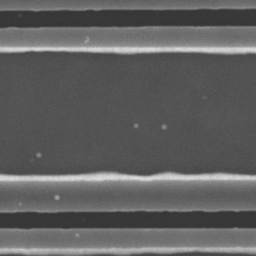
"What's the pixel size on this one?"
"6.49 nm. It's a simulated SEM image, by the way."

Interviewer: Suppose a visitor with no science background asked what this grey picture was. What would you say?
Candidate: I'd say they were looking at lines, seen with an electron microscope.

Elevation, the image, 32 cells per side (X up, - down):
XXXXXXXXXXXXXXXXXXXXXXXXXXXXXXXX
--------------------------------
--------------------------------
-XXX-XXXXXXXXXXXXXXXXXXXXXXXXXXX
XXXXXXXXXXXXXXXXXXXXXXXXXXXXXXXX
XXXXXXXXXXXXXXXXXXXXXXXXXXXXXXXX
--------------------------------
--------------------------------
--------------------------------
--------------------------------
--------------------------------
--------------------------------
--------------------------------
--------------------------------
--------------------------------
--------------------------------
--------------------------------
--------------------------------
--------------------------------
--------------------------------
--------------------------------
--------------------------------
XXXXXXXXXXXXXXXXXXXXXXXXXXXXXXXX
XXXXXXXXXXXXXXXXXXXXXXXXXXXXXXXX
XXXXXXXXXXXXXXXXXXXXXXXXXXXXXXXX
XXXXXXXXXXXXXXXXXXXXXXXXXXXXXXXX
--------------------------------
--------------------------------
--------------------------------
XXXXXXXXXXXXXXXXXXXXXXXXXXXXXXXX
XXXXXXXXXXXXXXXXXXXXXXXXXXXXXXXX
--------------------------------